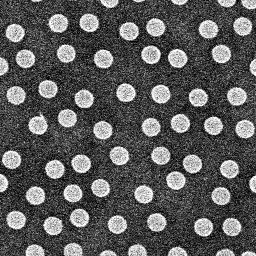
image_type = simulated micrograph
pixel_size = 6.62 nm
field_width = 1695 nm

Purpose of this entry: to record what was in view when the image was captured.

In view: a regular array of raised bodies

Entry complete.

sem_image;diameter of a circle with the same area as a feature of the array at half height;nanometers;116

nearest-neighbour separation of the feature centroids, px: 29.6